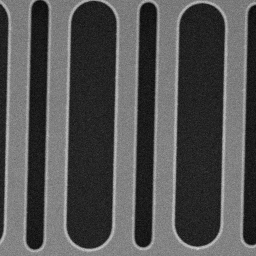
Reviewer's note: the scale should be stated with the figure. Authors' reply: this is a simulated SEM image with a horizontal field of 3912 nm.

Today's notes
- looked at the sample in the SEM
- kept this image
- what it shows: groups of lines, slits or small figures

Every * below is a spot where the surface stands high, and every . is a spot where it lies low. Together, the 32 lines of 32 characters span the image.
****..****...*****.*****..******
.***..***.....***...***.....***.
.***..***......**...**......***.
.***..***......**...**......***.
.***..***......**...**......***.
.***..***......**...**......***.
.***..***......**...**......***.
.***..***......**...**......***.
.***..***......**...**......***.
.***..***......**...**......***.
.***..***......**...**......***.
.***..**.......**...**......***.
.***..**.......**...**......***.
.***..**.......**...**......***.
.**...**.......**..***......**..
.**...**.......**..***......**..
.**...**.......**..***......**..
.**...**......***..***......**..
.**...**......***..***......**..
.**...**......***..***......**..
.**...**......***..***......**..
.**...**......***..***......**..
.**...**......***..***......**..
.**...**......***..***......**..
.**...**......***..***......**..
.**...**......***..***......**..
.**...**......***..***......**..
.**...**......***..***......**..
.**...**......***..***......**..
***...**......***..***.....***..
***..****....****..****...*****.
********************************